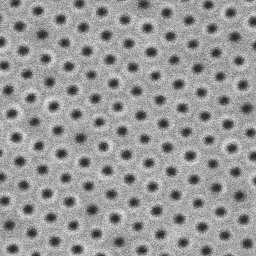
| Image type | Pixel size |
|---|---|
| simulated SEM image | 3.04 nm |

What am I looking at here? a regular array of holes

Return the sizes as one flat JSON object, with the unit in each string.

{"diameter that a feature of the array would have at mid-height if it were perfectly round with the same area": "32.7 nanometers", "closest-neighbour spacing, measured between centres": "72.7 nm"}